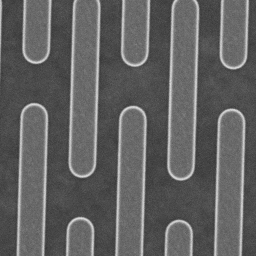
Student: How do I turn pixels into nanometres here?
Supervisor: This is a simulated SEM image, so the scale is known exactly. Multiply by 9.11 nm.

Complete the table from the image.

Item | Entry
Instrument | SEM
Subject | groups of lines, slits or small figures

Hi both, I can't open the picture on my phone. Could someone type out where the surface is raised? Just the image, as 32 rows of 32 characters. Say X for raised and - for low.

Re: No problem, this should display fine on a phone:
---XXX---XXX---XXXX---XXX---XXX-
---XXX---XXX---XXXX---XXX---XXX-
---XXX---XXX---XXXX---XXX---XXX-
---XXX---XXX---XXXX---XXX---XXX-
---XXX---XXX---XXX----XXX---XXX-
---XXX---XXX---XXX---XXXX---XXX-
---XXX---XXX---XXX---XXXX---XXX-
----XX---XXX----XX---XXXX---XXX-
---------XXX---------XXXX-------
---------XXX---------XXXX-------
---------XXX---------XXXX-------
---------XXX---------XXXX-------
---------XXX---------XXX--------
---XX----XXX----X----XXX--------
---XXX---XXX---XXX---XXX----XX--
---XXX---XXX---XXX---XXX---XXX--
---XXX---XXX---XXX---XXX---XXX--
---XXX---XXX---XXX---XXX---XXX--
---XXX---XXX---XXX---XXX---XXX--
---XXX---XXX---XXX---XXX---XXX--
--XXXX---XXX---XXX---XXX---XXX--
--XXXX---XX----XXX---XXX---XXX--
--XXXX---------XXX---------XXX--
--XXXX---------XXX---------XXX--
--XXXX---------XXX---------XXX--
--XXXX---------XXX---------XXX--
--XXXX---------XXX---------XXX--
--XXXX---XX----XXX---------XXX--
--XXXX---XXX---XXX---XXX---XXX--
--XXXX--XXXX---XXX---XXX---XXX--
--XXX---XXXX---XXX---XXX---XXX--
--XXX---XXXX---XXX---XXX---XXX--